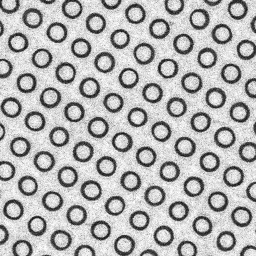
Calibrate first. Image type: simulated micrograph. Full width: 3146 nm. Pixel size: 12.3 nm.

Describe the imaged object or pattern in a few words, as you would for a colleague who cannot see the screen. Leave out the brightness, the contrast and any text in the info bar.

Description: a regular array of ring-shaped grooves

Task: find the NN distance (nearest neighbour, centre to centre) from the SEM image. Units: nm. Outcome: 340